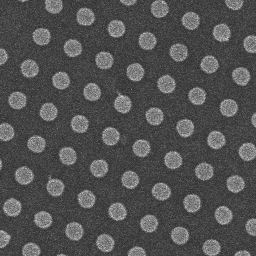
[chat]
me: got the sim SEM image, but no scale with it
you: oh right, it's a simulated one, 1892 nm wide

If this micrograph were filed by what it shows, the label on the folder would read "a regular array of raised bodies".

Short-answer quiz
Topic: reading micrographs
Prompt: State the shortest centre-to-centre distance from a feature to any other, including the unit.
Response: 33.2 pixels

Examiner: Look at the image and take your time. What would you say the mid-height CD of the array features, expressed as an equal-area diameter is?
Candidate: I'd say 0.127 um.